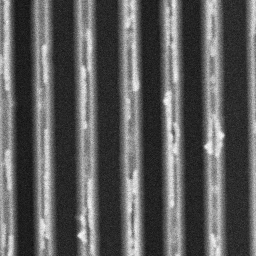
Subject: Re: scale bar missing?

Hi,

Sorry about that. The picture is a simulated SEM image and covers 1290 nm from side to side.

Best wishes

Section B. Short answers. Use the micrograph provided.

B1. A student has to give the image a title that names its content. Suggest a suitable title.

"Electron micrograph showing parallel lines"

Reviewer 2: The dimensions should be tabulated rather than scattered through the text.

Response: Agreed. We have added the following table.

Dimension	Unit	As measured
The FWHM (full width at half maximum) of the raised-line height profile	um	0.0838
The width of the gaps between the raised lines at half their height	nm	127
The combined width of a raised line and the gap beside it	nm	214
